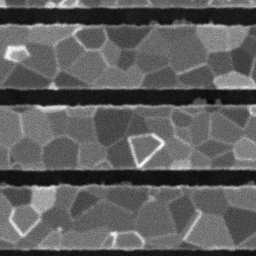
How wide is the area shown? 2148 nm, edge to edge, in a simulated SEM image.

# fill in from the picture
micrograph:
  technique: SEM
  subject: lines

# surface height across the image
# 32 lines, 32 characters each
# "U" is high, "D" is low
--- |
UUUUUUUUUUUUUUUUUUUUUUUUUUUUUUUU
DDDDDDDDDDDDDDDDDDDDDDDDDDDDDDDD
DDDDDDDDDDDDDDDDDDDDDDDDDDDDDDDD
UUUUUUUUUUUUUUUUUUUUUUUUUUUUUUUU
UUUUUUUUUUUUUUUUUUUUUUUUUUUUUUUU
UUUUUUUUUUUUUUUUUUUUUUUUUUUUUUUU
UUUUUUUUUUUUUUUUUUUUUUUUUUUUUUUU
UUUUUUUUUUUUUUUUUUUUUUUUUUUUUUUU
UUUUUUUUUUUUUUUUUUUUUUUUUUUUUUUU
UUUUUUUUUUUUUUUUUUUUUUUUUUUUUUUU
UUUUUUUUUUUUUUUUUUUUUUUUUUUUUUUU
DDDDDDDDDDDDDDDDDDDDDDDDDDDDDDDD
DDDDDDDDDDDDDDDDDDDDDDDDDDDDDDDD
UUUUUUUUUUUUUUUUUUUUUUUUUUUUUUUU
UUUUUUUUUUUUUUUUUUUUUUUUUUUUUUUU
UUUUUUUUUUUUUUUUUUUUUUUUUUUUUUUU
UUUUUUUUUUUUUUUUUUUUUUUUUUUUUUUU
UUUUUUUUUUUUUUUUUUUUUUUUUUUUUUUU
UUUUUUUUUUUUUUUUUUUUUUUUUUUUUUUU
UUUUUUUUUUUUUUUUUUUUUUUUUUUUUUUU
UUUUUUUUUUUUUUUUUUUUUUUUUUUUUUUU
DDDDDDDDDDDDDDDDDDDDDDDDDDDDDDDD
DDDDDDDDDDDDDDDDDDDDDDDDDDDDDDDD
UUUUUUUUUUUUUUUUUUUUUUUUUUUUUUUU
UUUUUUUUUUUUUUUUUUUUUUUUUUUUUUUU
UUUUUUUUUUUUUUUUUUUUUUUUUUUUUUUU
UUUUUUUUUUUUUUUUUUUUUUUUUUUUUUUU
UUUUUUUUUUUUUUUUUUUUUUUUUUUUUUUU
UUUUUUUUUUUUUUUUUUUUUUUUUUUUUUUU
UUUUUUUUUUUUUUUUUUUUUUUUUUUUUUUU
UUUUUUUUUUUUUUUUUUUUUUUUUUUUUUUU
DDDDDDDDDDDDDDDDDDDDDDDDDDDDDDDD